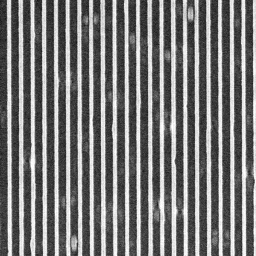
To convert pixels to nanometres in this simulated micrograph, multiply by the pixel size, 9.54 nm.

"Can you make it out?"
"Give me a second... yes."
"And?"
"parallel lines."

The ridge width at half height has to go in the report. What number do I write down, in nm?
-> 31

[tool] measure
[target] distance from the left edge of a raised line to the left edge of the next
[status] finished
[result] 112 nanometers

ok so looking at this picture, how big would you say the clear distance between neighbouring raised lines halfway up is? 78.7 nm